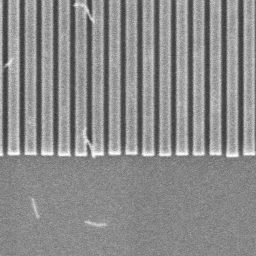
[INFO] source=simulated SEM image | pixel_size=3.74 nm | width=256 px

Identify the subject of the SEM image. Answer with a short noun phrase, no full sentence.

parallel lines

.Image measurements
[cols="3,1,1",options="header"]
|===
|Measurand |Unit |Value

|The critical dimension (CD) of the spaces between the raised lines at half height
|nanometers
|22.5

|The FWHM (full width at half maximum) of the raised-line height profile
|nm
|40.7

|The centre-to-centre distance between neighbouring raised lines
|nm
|62.9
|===